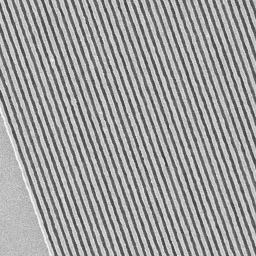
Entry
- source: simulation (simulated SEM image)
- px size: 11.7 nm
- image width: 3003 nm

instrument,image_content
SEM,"parallel lines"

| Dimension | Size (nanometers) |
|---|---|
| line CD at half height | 40.2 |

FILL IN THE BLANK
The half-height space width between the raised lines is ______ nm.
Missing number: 40.2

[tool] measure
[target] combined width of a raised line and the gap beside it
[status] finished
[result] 0.0825 µm